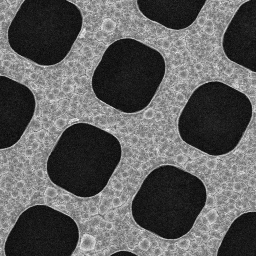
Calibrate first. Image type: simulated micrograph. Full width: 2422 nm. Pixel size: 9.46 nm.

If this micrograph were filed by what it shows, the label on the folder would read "holes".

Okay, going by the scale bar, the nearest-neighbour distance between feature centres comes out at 901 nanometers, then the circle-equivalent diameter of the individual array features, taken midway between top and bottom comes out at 679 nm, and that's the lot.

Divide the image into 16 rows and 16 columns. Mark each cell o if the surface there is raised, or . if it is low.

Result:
o....oooo....oo.
o....ooooo..oo..
o....oo.oooooo..
o...oo....oooo..
oooooo....oooooo
..oooo....oo...o
..ooooo..ooo....
..ooooooooo.....
.ooo...oooo....o
ooo.....ooooo.oo
ooo....ooo.ooooo
ooo....oo....ooo
oooooooo.....ooo
o...oooo....ooo.
o....oooo...oo..
.....ooooooooo..